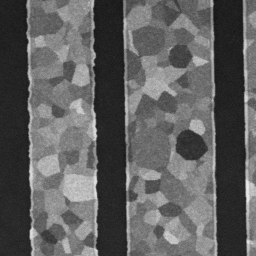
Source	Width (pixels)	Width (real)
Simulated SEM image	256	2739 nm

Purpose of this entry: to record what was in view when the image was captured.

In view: one or a few lines or trenches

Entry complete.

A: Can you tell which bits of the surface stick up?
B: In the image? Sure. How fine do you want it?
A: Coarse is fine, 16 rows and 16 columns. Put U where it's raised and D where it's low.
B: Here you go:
DDUUUUDDUUUUUDDU
DDUUUUDDUUUUUDDU
DDUUUUDDUUUUUDDU
DDUUUUDDUUUUUDDU
DDUUUUDDUUUUUDDU
DDUUUUDDUUUUUDDU
DDUUUUDDUUUUUDDU
DDUUUUDDUUUUUDDU
DDUUUUDDUUUUUDDU
DDUUUUDDUUUUUDDU
DDUUUUDDUUUUUDDU
DDUUUUDDUUUUUDDU
DDUUUUDDUUUUUDDU
DDUUUUDDUUUUUDDD
DDUUUUDDUUUUUDDD
DDUUUUDDUUUUUDDD